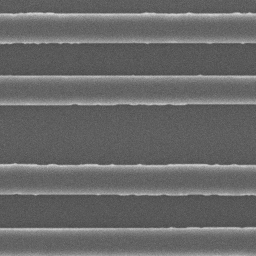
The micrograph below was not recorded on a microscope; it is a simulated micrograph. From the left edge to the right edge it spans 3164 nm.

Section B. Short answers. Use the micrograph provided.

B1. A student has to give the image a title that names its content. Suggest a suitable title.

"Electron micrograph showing lines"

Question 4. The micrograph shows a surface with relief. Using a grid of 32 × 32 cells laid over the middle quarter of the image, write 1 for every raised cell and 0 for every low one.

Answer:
00000000000000000000000000000000
00000000000000000000000000000000
00000000000000000000000000000000
11111111111111111111111111111111
11111111111111111111111111111111
11111111111111111111111111111111
11111111111111111111111111111111
11111111111111111111111111111111
11111111111111111111111111111111
11111111111111111111111111111111
00000000000000000000000000000000
00000000000000000000000000000000
00000000000000000000000000000000
00000000000000000000000000000000
00000000000000000000000000000000
00000000000000000000000000000000
00000000000000000000000000000000
00000000000000000000000000000000
00000000000000000000000000000000
00000000000000000000000000000000
00000000000000000000000000000000
00000000000000000000000000000000
00000000000000000000000000000000
00000000000000000000000000000000
00000000000000000000000000000000
11111111111111111111111111111111
11111111111111111111111111111111
11111111111111111111111111111111
11111111111111111111111111111111
11111111111111111111111111111111
11111111111111111111111111111111
11111111111111111111111111111111